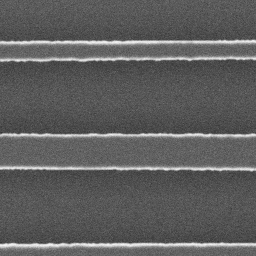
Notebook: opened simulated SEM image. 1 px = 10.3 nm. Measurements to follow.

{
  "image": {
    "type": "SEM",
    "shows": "lines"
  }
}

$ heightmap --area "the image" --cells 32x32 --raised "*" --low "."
................................
................................
................................
................................
................................
********************************
********************************
****************.*.*...*........
................................
................................
................................
................................
................................
................................
................................
................................
................................
********************************
********************************
********************************
********************************
................................
................................
................................
................................
................................
................................
................................
................................
................................
.*..*.*..***********************
********************************